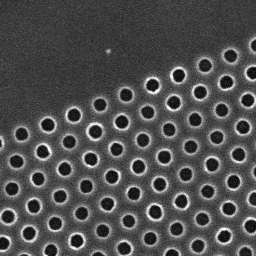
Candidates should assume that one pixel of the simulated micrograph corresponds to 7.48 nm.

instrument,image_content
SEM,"a regular array of holes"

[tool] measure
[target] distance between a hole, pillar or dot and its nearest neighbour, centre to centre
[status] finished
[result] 204 nm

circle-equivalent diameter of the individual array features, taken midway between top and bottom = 103 nm